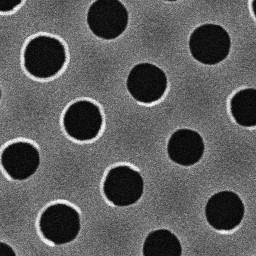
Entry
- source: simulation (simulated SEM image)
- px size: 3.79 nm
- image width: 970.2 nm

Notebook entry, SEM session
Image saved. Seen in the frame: a regular array of holes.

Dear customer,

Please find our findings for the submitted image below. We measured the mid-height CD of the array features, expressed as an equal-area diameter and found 0.151 um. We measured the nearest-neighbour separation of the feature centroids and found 280 nm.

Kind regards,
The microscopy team